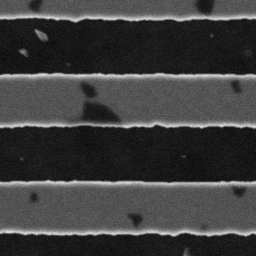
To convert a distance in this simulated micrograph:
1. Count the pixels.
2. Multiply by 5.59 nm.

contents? lines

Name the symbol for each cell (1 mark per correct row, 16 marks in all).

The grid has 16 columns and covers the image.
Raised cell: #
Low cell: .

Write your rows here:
################
................
................
................
................
################
################
################
................
................
................
################
################
################
################
................